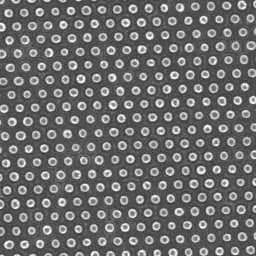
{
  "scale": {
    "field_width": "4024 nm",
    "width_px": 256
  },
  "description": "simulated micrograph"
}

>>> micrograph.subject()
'a regular array of raised bodies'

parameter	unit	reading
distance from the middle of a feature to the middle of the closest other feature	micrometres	0.238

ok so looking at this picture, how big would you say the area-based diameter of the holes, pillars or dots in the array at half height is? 0.123 micrometres